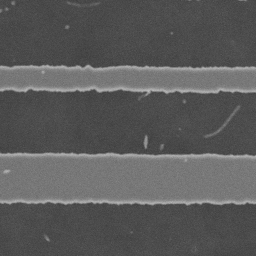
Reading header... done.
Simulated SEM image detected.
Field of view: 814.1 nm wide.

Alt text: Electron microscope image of lines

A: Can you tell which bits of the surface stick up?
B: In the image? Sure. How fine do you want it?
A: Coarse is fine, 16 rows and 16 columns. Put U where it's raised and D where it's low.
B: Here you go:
DDDDDDDDDDDDDDDD
DDDDDDDDDDDDDDDD
DDDDDDDDDDDDDDDD
DDDDDDDDDDDDDDDD
UUUUUUUUUUUUUUUU
UUUUUUUUUUUUUUUU
DDDDDDDDDDDDDDDD
DDDDDDDDDDDDDDDD
DDDDDDDDDDDDDDDD
DDDDDDDDDDDDDDDD
UUUUUUUUUUUUUUUU
UUUUUUUUUUUUUUUU
UUUUUUUUUUUUUUUU
DDDDDDDDDDDDDDDD
DDDDDDDDDDDDDDDD
DDDDDDDDDDDDDDDD